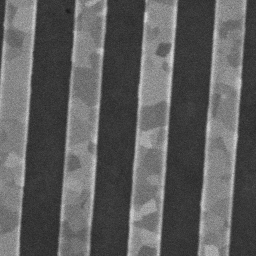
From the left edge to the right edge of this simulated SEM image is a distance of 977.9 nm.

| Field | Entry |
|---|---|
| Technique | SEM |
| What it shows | one or a few lines or trenches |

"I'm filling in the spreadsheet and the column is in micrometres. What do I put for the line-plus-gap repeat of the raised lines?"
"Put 0.267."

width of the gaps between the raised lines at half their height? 0.156 micrometres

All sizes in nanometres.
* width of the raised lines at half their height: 110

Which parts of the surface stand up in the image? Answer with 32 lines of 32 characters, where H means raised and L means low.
LHHHLLLLLLHHHLLLLLHHHHLLLLLHHHHL
LHHHLLLLLLHHHLLLLLHHHHLLLLLHHHHL
LHHHLLLLLHHHHLLLLLHHHHLLLLLHHHLL
LHHHLLLLLHHHHLLLLLHHHHLLLLLHHHLL
LHHHLLLLLHHHHLLLLLHHHHLLLLLHHHLL
LHHHLLLLLHHHHLLLLLHHHHLLLLLHHHLL
HHHHLLLLLHHHHLLLLLHHHHLLLLLHHHLL
HHHHLLLLLHHHHLLLLLHHHLLLLLLHHHLL
HHHHLLLLLHHHHLLLLLHHHLLLLLLHHHLL
HHHHLLLLLHHHHLLLLLHHHLLLLLLHHHLL
HHHHLLLLLHHHLLLLLLHHHLLLLLHHHHLL
HHHHLLLLLHHHLLLLLHHHHLLLLLHHHHLL
HHHHLLLLLHHHLLLLLHHHHLLLLLHHHHLL
HHHHLLLLLHHHLLLLLHHHHLLLLLHHHHLL
HHHLLLLLLHHHLLLLLHHHHLLLLLHHHHLL
HHHLLLLLLHHHLLLLLHHHHLLLLLHHHHLL
HHHLLLLLHHHHLLLLLHHHHLLLLLHHHHLL
HHHLLLLLHHHHLLLLLHHHHLLLLLHHHLLL
HHHLLLLLHHHHLLLLLHHHHLLLLLHHHLLL
HHHLLLLLHHHHLLLLLHHHHLLLLLHHHLLL
HHHLLLLLHHHHLLLLLHHHHLLLLLHHHLLL
HHHLLLLLHHHHLLLLLHHHHLLLLLHHHLLL
HHHLLLLLHHHHLLLLLHHHLLLLLLHHHLLL
HHHLLLLLHHHHLLLLLHHHLLLLLHHHHLLL
HHHLLLLLHHHHLLLLLHHHLLLLLHHHHLLL
HHHLLLLLHHHLLLLLHHHHLLLLLHHHHLLL
HHHLLLLLHHHLLLLLHHHHLLLLLHHHHLLL
HHHLLLLLHHHLLLLLHHHHLLLLLHHHHLLL
HHLLLLLLHHHLLLLLHHHHLLLLLHHHHLLL
HHLLLLLLHHHLLLLLHHHHLLLLLHHHHLLL
HHLLLLLHHHHLLLLLHHHHLLLLLHHHHLLL
HHLLLLLHHHHLLLLLHHHHLLLLLHHHLLLL